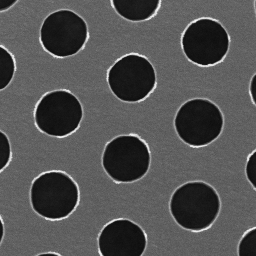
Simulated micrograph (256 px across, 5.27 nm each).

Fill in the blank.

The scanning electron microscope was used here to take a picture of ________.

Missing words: a regular array of holes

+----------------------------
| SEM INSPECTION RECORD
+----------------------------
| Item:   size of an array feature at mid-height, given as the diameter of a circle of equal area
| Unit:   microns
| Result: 0.242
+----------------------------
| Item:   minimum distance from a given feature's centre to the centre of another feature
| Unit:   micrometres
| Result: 0.424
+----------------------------